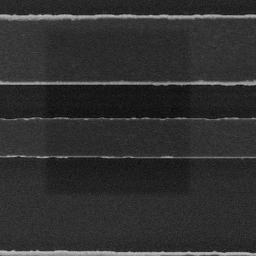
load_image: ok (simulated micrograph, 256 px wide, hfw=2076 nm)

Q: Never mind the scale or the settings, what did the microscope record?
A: lines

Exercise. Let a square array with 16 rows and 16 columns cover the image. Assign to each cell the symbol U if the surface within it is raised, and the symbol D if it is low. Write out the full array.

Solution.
DDDDDDDDDDDDDDDD
UUUUUUUUUUUUUUUU
UUUUUUUUUUUUUUUU
UUUUUUUUUUUUUUUU
UUUUUUUUUUUUUUUU
DDDDDDDDDDDDDDDD
DDDDDDDDDDDDDDDD
UUUUUUUUUUUUUUUU
UUUUUUUUUUUUUUUU
UUUUUUUUUUUUUUUU
DDDDDDDDDDDDDDDD
DDDDDDDDDDDDDDDD
DDDDDDDDDDDDDDDD
DDDDDDDDDDDDDDDD
DDDDDDDDDDDDDDDD
DDDDDDDDDDDDDDDD